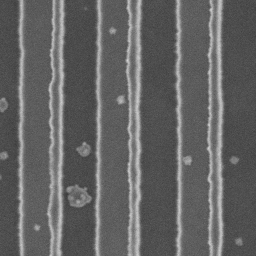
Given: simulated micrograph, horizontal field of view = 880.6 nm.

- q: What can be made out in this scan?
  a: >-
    lines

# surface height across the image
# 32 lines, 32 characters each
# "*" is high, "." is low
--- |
...*****....*****.....******....
...*****....*****.....******....
...*****....*****.....******....
...*****....*****.....*****.....
...*****....*****.....*****.....
...*****....*****.....*****.....
...*****....*****.....*****.....
...*****....*****.....*****.....
...*****....*****.....*****.....
...*****....*****.....*****.....
...*****....*****.....*****.....
...*****....*****.....******....
...*****....*****.....******....
...*****....*****.....******....
...*****....*****.....******....
...*****....*****.....******....
...*****....*****.....******....
...*****....*****......*****....
...*****....*****.....******....
...*****....*****.....*****.....
...*****....*****.....******....
...****.....*****......*****....
...****.....*****.....******....
...*****....*****......*****....
...*****....*****.....******....
...*****....*****.....******....
...*****....*****.....******....
...*****....*****.....******....
...****.....*****.....******....
...****.....*****.....******....
...****.....*****.....******....
...****.....*****.....*****.....